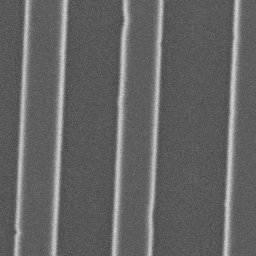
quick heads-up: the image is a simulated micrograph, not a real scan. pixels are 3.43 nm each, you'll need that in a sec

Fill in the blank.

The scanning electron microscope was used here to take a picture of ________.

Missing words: one or a few lines or trenches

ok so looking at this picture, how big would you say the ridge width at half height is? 130 nm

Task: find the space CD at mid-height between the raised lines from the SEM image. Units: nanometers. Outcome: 229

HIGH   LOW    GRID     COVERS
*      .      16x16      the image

..**....**.....*
..**....**.....*
..**....**.....*
..**....**.....*
..**....**.....*
.***....**.....*
.***....**.....*
.***....**....**
.***...***....**
.***...***....**
.***...***....**
.***...***....**
.***...***....**
.**....**.....**
.**....**.....**
.**....**.....**